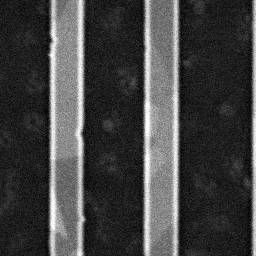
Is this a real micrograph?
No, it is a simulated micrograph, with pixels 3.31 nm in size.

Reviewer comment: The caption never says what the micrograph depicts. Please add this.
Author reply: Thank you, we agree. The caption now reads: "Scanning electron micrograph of one or a few lines or trenches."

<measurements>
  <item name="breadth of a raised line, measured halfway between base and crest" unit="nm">93.5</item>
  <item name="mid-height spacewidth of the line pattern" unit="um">0.244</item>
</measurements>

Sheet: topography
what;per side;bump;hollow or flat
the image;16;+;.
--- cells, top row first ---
...++....++.....
...++....++.....
...++....++.....
...++....++.....
...++....++.....
...++....++.....
...++....++.....
...++....++.....
...++....++.....
...++....++.....
...++....++.....
...++....++.....
...++....++.....
...++....++.....
...++....++.....
...++....++.....